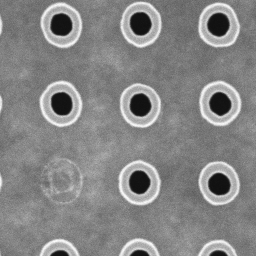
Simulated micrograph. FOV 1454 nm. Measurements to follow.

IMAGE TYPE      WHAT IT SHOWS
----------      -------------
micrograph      a regular array of ring-shaped raised bodies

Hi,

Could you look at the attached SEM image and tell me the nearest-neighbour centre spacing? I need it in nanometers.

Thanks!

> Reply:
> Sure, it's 444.